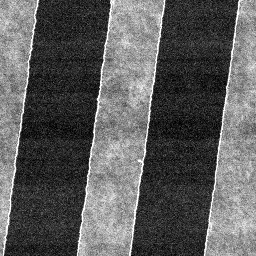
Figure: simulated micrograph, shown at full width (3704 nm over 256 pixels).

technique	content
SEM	one or a few lines or trenches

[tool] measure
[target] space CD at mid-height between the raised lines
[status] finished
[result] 751 nm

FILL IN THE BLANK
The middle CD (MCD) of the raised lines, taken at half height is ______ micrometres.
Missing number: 1.07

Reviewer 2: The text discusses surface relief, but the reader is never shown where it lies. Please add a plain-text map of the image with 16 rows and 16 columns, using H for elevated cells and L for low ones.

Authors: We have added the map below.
LLHHHHHLLLHHHHHL
LLHHHHHLLLHHHHHL
LLHHHHHLLLHHHHHL
LLHHHHHLLLHHHHLL
LLHHHHLLLLHHHHLL
LLHHHHLLLLHHHHLL
LHHHHHLLLHHHHHLL
LHHHHHLLLHHHHHLL
LHHHHHLLLHHHHHLL
LHHHHHLLLHHHHHLL
LHHHHHLLLHHHHHLL
LHHHHLLLLHHHHLLL
LHHHHLLLLHHHHLLL
LHHHHLLLHHHHHLLL
HHHHHLLLHHHHHLLL
HHHHHLLLHHHHHLLL